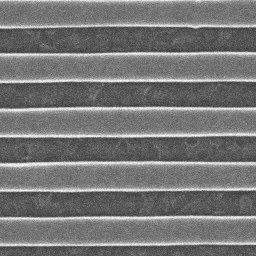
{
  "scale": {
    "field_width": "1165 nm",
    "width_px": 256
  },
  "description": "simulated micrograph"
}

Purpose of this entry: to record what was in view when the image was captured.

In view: parallel lines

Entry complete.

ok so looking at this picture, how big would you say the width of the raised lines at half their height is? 124 nm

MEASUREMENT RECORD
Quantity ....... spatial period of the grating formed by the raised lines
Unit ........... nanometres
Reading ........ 248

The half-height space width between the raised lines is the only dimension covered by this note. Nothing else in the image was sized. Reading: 126 nm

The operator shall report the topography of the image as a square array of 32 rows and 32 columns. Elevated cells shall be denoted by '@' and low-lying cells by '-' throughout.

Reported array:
@@@@@@@@@@@@@@@@@@@@@@@@@@@@@@@@
@@@@@@@@@@@@@@@@@@@@@@@@@@@@@@@@
@@@@@@@@@@@@@@@@@@@@@@@@@@@@@@@@
--------------------------------
--------------------------------
--------------------------------
--------------------------------
@@@@@@@@@@@@@@@@@@@@@@@@@@@@@@@@
@@@@@@@@@@@@@@@@@@@@@@@@@@@@@@@@
@@@@@@@@@@@@@@@@@@@@@@@@@@@@@@@@
--------------------------------
--------------------------------
--------------------------------
--------------------------------
@@@@@@@@@@@@@@@@@@@@@@@@@@@@@@@@
@@@@@@@@@@@@@@@@@@@@@@@@@@@@@@@@
@@@@@@@@@@@@@@@@@@@@@@@@@@@@@@@@
--------------------------------
--------------------------------
--------------------------------
------@@@@@@@@@@@@@@@@@@@@@@@@@@
@@@@@@@@@@@@@@@@@@@@@@@@@@@@@@@@
@@@@@@@@@@@@@@@@@@@@@@@@@@@@@@@@
@@@@@@@@@@@@@@@@@@@@@@@@@@@@@@@@
--------------------------------
--------------------------------
--------------------------------
@@@@@@@@@@@@@@@@@@@@@@@@@@@@@@@@
@@@@@@@@@@@@@@@@@@@@@@@@@@@@@@@@
@@@@@@@@@@@@@@@@@@@@@@@@@@@@@@@@
@@@@@@@@@@@@@@@@@@@@@@@---------
--------------------------------